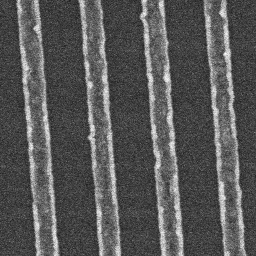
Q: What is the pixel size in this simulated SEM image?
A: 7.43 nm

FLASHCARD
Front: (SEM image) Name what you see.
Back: parallel lines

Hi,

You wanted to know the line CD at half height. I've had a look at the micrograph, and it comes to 151 nm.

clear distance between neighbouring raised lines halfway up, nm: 307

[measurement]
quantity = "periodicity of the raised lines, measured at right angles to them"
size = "462 nanometers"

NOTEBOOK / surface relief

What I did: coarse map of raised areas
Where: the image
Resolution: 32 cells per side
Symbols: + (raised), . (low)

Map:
..+++.....++......++......++....
..+++.....+++.....++......++....
..+++.....+++.....+++.....++....
..+++.....+++.....+++.....++....
...++.....+++.....+++.....++....
...++.....+++.....+++.....+++...
...++.....+++.....+++.....+++...
...++......++.....+++.....+++...
...++......++.....+++.....+++...
...++......++......++.....+++...
...+++.....++......++.....+++...
...+++.....++......++......++...
...+++.....+++.....++......++...
...+++.....+++.....++......++...
...+++.....+++.....++......++...
...+++.....+++.....++......++...
...+++.....+++.....+++.....++...
....++.....+++.....+++.....++...
....++......++.....+++.....+++..
....++......++.....+++.....+++..
....++......++......++.....+++..
....++......++......++.....+++..
....+++.....++......++.....+++..
....+++.....++......++.....+++..
....+++.....++......++.....+++..
....+++.....+++.....++......++..
....+++.....+++.....++......++..
....+++.....+++.....+++.....++..
....+++.....+++.....+++.....++..
....+++.....+++.....+++.....++..
.....++.....+++.....+++.....++..
.....++.....+++.....+++.....+++.